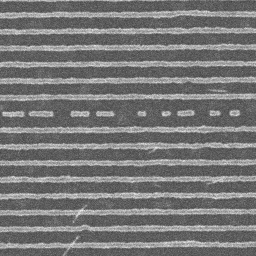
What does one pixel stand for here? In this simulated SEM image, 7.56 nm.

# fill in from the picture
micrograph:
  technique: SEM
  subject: parallel lines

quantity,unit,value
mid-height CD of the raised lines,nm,32.1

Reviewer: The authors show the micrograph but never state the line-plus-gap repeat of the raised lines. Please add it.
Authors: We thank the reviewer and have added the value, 124 nm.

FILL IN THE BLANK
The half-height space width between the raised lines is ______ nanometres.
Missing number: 92.6